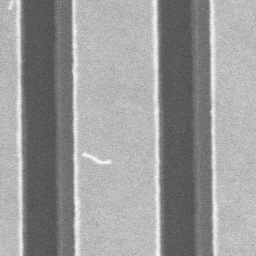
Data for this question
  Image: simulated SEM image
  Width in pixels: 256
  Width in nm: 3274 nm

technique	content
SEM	lines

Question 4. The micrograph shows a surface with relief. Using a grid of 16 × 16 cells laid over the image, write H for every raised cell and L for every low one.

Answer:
HLLLLHHHHHLLLHHH
HLLLLHHHHHLLLHHH
HLLLLHHHHHLLLHHH
HLLLLHHHHHLLLHHH
HLLLLHHHHHLLLHHH
HLLLLHHHHHLLLHHH
HLLLLHHHHHLLLHHH
HLLLLHHHHHLLLHHH
HLLLLHHHHHLLLHHH
HLLLLHHHHHLLLHHH
HLLLLHHHHHLLLHHH
HLLLLHHHHHLLLHHH
HLLLLHHHHHLLLHHH
HLLLLHHHHHLLLHHH
HLLLLHHHHHLLLHHH
HLLLLHHHHHLLLHHH